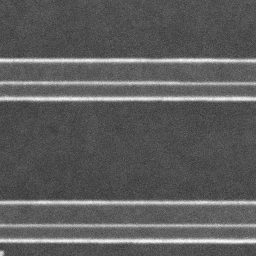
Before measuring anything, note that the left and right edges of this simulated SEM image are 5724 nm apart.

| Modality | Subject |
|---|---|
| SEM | lines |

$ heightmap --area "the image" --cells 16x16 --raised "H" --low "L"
LLLLLLLLLLLLLLLL
LLLLLLLLLLLLLLLL
LLLLLLLLLLLLLLLL
LLLLLLLLLLLLLLLL
HHHHHHHHHHHHHHHH
HHHHHHHHHHHHHHHH
LLLLLLLLLLLLLLLL
LLLLLLLLLLLLLLLL
LLLLLLLLLLLLLLLL
LLLLLLLLLLLLLLLL
LLLLLLLLLLLLLLLL
LLLLLLLLLLLLLLLL
LLLLLLLLLLLLLLLL
HHHHHHHHHHHHHHHH
HHHHHHHHHHHHHHHH
LLLLLLLLLLLLLLLL